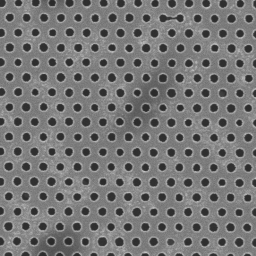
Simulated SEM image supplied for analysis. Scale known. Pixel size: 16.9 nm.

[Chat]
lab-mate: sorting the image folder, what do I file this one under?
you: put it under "a regular array of holes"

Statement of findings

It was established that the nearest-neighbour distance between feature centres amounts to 0.282 micrometres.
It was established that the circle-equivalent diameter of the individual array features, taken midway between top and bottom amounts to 138 nm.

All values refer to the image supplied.